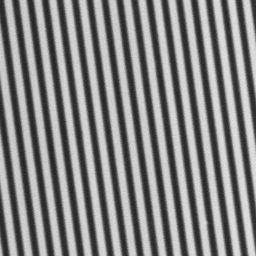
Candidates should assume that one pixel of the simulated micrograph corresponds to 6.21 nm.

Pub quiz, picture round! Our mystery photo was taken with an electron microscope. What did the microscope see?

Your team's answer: parallel lines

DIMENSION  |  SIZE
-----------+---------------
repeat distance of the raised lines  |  0.0915 µm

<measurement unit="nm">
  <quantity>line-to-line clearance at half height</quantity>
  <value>46.1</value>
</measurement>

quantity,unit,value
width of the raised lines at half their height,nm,46.1